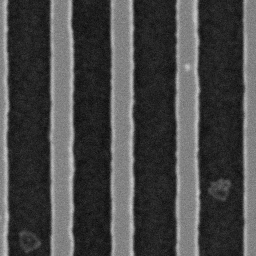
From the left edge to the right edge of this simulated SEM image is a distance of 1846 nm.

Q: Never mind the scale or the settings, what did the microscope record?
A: lines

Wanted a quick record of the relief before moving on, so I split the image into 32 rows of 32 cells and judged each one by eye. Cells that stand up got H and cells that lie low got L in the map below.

HLLLLLHHHLLLLLHHHLLLLLHHHLLLLLLH
HLLLLLHHHLLLLLHHHLLLLLHHHLLLLLLH
HLLLLLHHHLLLLLHHHLLLLLHHHLLLLLLH
HLLLLLHHHLLLLLHHHLLLLLHHHLLLLLLH
HLLLLLHHHLLLLLHHHLLLLLHHHLLLLLLH
HLLLLLHHHLLLLLHHHLLLLLHHHLLLLLLH
HLLLLLHHHLLLLLHHHLLLLLHHHLLLLLLH
HLLLLLHHHLLLLLHHHLLLLLHHHLLLLLLH
HLLLLLHHHLLLLLHHHLLLLLHHHLLLLLLH
HLLLLLHHHLLLLLHHHLLLLLHHHLLLLLLH
HLLLLLHHHLLLLLHHHLLLLLHHHLLLLLLH
HLLLLLHHHLLLLLHHHLLLLLHHHLLLLLLH
HLLLLLHHHLLLLLHHHLLLLLHHHLLLLLLH
HLLLLLHHHLLLLLHHHLLLLLHHHLLLLLLH
HLLLLLHHHLLLLLHHHLLLLLHHHLLLLLLH
HLLLLLHHHLLLLLHHHLLLLLHHHLLLLLLH
HLLLLLHHHLLLLLHHHLLLLLHHHLLLLLLH
HLLLLLHHHLLLLLHHHLLLLLHHHLLLLLLH
HLLLLLHHHLLLLLHHHLLLLLHHHLLLLLLH
HLLLLLHHHLLLLLHHHLLLLLHHHLLLLLLH
HLLLLLHHHLLLLLHHHLLLLLHHHLLLLLLH
HLLLLLHHHLLLLLHHHLLLLLHHHLLLLLLH
HLLLLLLHHLLLLLHHHLLLLLHHHLLLLLLH
HLLLLLHHHLLLLLHHHLLLLLHHHLLLLLLH
HLLLLLHHHLLLLLHHHLLLLLHHHLLLLLLH
HLLLLLLHHLLLLLHHHLLLLLHHHLLLLLLH
HLLLLLLHHLLLLLHHHLLLLLHHHLLLLLLH
HLLLLLLHHLLLLLHHHLLLLLHHHLLLLLLH
HLLLLLLHHLLLLLHHHLLLLLHHHLLLLLLH
HLLLLLHHHLLLLLHHHLLLLLHHHLLLLLLH
HLLLLLHHHLLLLLHHHLLLLLHHHLLLLLLH
HLLLLLHHHLLLLLHHHLLLLLHHHLLLLLLH